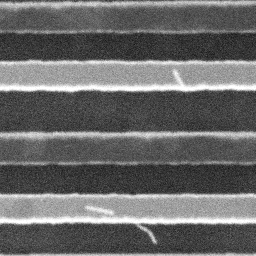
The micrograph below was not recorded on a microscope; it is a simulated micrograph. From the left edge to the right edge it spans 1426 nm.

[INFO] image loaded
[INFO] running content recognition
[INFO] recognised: lines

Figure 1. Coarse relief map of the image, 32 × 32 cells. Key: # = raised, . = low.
........######.#################
################################
################################
################################
................................
................................
................................
................................
################################
################################
################################
................................
................................
................................
................................
................................
................................
################################
################################
################################
................................
................................
................................
................................
################.###############
################################
################################
################################
................................
................................
................................
................................